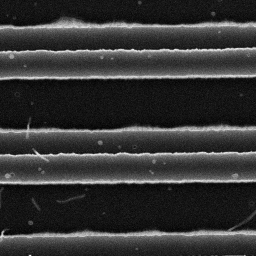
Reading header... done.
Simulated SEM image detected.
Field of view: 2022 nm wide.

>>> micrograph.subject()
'lines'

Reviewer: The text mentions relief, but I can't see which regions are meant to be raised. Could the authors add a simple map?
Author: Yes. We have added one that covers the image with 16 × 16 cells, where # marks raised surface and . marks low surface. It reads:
................
................
################
################
################
................
................
................
################
################
################
................
................
................
................
################